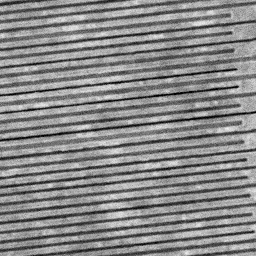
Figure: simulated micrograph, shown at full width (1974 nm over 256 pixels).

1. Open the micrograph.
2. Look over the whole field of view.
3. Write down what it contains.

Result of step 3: parallel lines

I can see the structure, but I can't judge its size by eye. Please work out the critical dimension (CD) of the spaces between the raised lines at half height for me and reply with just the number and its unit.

27.8 nanometers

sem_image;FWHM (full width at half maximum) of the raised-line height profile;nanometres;41.2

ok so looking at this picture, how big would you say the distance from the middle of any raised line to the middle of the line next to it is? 70.1 nanometres